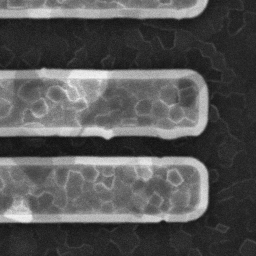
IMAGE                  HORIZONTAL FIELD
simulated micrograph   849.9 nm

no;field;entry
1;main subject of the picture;one or a few lines or trenches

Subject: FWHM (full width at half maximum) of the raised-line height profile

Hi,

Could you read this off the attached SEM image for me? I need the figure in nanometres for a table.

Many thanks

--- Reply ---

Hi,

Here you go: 191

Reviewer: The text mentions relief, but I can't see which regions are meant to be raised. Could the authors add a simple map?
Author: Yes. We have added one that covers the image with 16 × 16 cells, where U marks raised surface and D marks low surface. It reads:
UUUUUUUUUUUUDDDD
DDDDDDDDDDDDDDDD
DDDDDDDDDDDDDDDD
DDDDDDDDDDDDDDDD
DDDDDDDDDDDDDDDD
UUUUUUUUUUUUUDDD
UUUUUUUUUUUUUDDD
UUUUUUUUUUUUUDDD
DDDDDDDDDDDDDDDD
DDDDDDDDDDDDDDDD
UUUUUUUUUUUUDDDD
UUUUUUUUUUUUUDDD
UUUUUUUUUUUUUDDD
UUUUUUUUUUUUDDDD
DDDDDDDDDDDDDDDD
DDDDDDDDDDDDDDDD